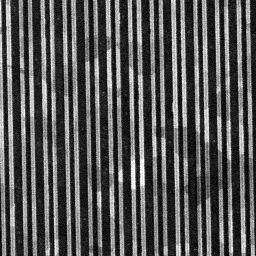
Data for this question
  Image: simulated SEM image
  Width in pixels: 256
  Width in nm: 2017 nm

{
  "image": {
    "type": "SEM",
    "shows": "parallel lines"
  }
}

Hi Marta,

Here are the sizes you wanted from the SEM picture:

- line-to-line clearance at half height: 0.0492 µm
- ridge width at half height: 24.6 nm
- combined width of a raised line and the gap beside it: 85.7 nm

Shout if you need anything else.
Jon